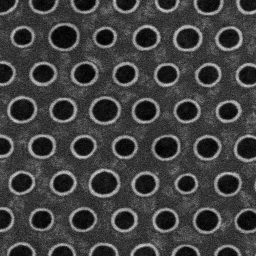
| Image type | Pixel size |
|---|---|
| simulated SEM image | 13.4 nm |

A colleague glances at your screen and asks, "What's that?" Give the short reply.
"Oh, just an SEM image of a regular array of raised bodies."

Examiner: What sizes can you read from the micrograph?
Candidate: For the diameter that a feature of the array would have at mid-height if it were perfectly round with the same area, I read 318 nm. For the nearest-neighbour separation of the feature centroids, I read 554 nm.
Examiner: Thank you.